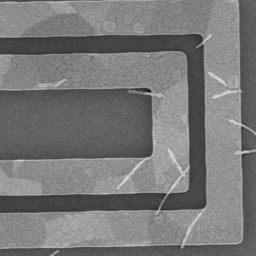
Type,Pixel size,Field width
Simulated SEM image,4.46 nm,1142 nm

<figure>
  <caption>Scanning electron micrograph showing groups of lines, slits or small figures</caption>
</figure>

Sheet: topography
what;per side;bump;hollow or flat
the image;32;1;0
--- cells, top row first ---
11111111111111111111111111111100
11111111111111111111111111111100
11111111111111111111111111111100
11111111111111111111111111111100
11111110000000000000000001111100
00000000000000000000000001111100
00000000000000000000110000111100
11111111111111111111111000111100
11111111111111111111111000111100
11111111111111111111111000111100
11111111111111111111111000111100
00000000000000000001111000111100
00000000000000000001111000111100
00000000000000000001111000111100
00000000000000000001111000111100
00000000000000000001111100111100
00000000000000000001111100111100
00000000000000000001111100111100
00000000000000000001111100111100
00000000000000000001111100111100
11111111111111111111111100111100
11111111111111111111111100111100
11111111111111111111111100111100
11111111111111111111111000111100
00000000000000000000000000111100
00000000000000000000000000111100
00000000001111111111111111111100
11111111111111111111111111111100
11111111111111111111111111111100
11111111111111111111111111111100
11111111111111111111111111000000
00000000000000000000000000000000